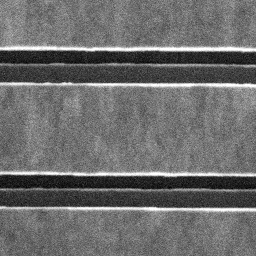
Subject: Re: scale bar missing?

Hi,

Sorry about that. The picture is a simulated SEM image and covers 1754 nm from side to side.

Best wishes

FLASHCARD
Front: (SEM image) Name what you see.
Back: lines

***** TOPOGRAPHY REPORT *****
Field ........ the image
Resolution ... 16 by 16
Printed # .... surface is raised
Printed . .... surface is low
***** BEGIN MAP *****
################
################
################
................
................
################
################
################
################
################
################
................
................
################
################
################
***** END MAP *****